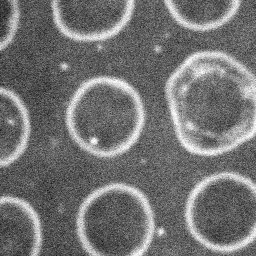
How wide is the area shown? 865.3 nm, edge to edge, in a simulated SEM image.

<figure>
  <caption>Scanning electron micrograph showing raised bodies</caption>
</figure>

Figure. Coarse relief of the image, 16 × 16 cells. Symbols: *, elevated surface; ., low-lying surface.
*..*****...****.
*...****....**..
................
............**..
...........****.
.....***...*****
*....****..*****
**..*****..*****
**...***...*****
*.....*.........
................
.............***
*.....***...****
**...****...****
**...****...****
**....***.....*.